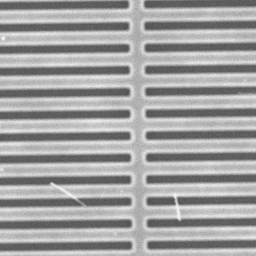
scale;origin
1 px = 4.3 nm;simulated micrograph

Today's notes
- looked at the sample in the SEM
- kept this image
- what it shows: groups of lines, slits or small figures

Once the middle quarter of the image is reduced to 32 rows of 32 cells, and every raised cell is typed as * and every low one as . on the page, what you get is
................*****...........
.................***............
................*****...........
********************************
********************************
********************************
.................***............
.................***............
.......*************************
********************************
********************************
................****............
.................***............
................*****...........
********************************
********************************
********************************
.................***............
.................***............
********************************
********************************
********************************
.................****...........
.................***............
.................****...........
********************************
********************************
*************************.......
.................***............
.................****...........
********************************
********************************